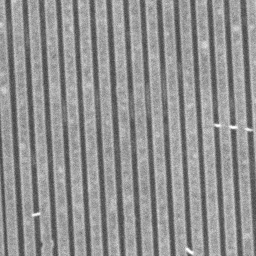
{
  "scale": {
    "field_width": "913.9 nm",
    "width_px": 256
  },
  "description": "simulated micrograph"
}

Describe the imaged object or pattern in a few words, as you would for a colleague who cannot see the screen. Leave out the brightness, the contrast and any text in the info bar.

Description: parallel lines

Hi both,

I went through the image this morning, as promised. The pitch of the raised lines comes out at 59.8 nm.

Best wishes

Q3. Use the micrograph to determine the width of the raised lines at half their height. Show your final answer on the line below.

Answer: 37.4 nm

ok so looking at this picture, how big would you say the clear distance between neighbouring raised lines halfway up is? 6.11 px